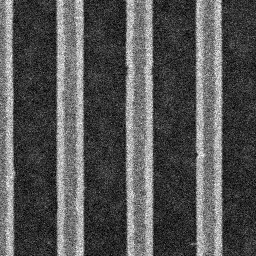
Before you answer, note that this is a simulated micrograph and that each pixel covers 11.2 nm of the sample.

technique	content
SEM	one or a few lines or trenches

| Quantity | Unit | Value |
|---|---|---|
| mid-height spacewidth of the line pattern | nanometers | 565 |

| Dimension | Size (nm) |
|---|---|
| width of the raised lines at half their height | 215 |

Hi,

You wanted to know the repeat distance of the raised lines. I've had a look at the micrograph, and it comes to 774 nanometres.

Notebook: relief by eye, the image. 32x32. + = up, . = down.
+.......++......+++......++.....
+.......++......+++......++.....
+.......++......+++......++.....
+.......++......+++......++.....
+.......++......+++......++.....
+.......++......+++......++.....
+.......++......+++......++.....
+.......++......+++......++.....
+.......++......+++......++.....
+.......++......+++......++.....
+.......++......+++......++.....
+.......++......+++......++.....
+.......++......+++......++.....
+.......++......+++......++.....
+.......++......+++......++.....
+.......++......+++......++.....
+.......++......+++......++.....
+.......++......+++......++.....
+.......++......+++......++.....
+.......++......+++......++.....
+.......++......+++......++.....
+......+++......+++......++.....
+......+++......+++......++.....
+.......++......+++......++.....
+.......++......+++......++.....
+.......++......+++......++.....
+.......++......+++......++.....
+.......++......+++......++.....
+.......++......+++......++.....
+.......++......+++......++.....
+.......++......+++......++.....
+.......++......+++......++.....